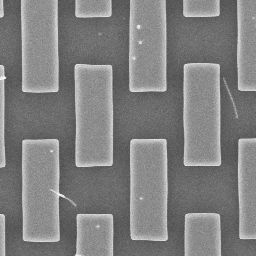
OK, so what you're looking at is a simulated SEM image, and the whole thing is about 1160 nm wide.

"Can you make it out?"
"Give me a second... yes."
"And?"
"groups of lines, slits or small figures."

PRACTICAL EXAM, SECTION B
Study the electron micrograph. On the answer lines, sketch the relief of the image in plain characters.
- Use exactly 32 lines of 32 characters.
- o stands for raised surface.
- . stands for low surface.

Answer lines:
...oooo..ooooo..ooooo..oooo...oo
...oooo..ooooo..ooooo..oooo...oo
...oooo.........ooooo.........oo
...oooo.........ooooo.........oo
...oooo.........ooooo.........oo
...oooo.........ooooo.........oo
...oooo.........ooooo.........oo
...oooo.........ooooo.........oo
...oooo..ooooo..ooooo..oooo...oo
o..oooo..ooooo..ooooo..oooo...oo
...oooo..ooooo..ooooo..oooo...oo
.........ooooo.........oooo.....
.........ooooo.........oooo.....
.........ooooo.........oooo.....
.........ooooo.........oooo.....
..........oooo.........oooo.....
..........oooo.........oooo.....
.........ooooo....oo...oooo...oo
o..oooo..ooooo..ooooo..oooo...oo
o..oooo..ooooo..ooooo..ooooo..oo
o..oooo..ooooo..ooooo..oooo...oo
...oooo.........ooooo.........oo
...oooo.........ooooo.........oo
...oooo.........ooooo.........oo
...oooo.........ooooo.........oo
...oooo.........ooooo.........oo
...oooo.........ooooo.........oo
o..oooo...oooo..ooooo..oooo...oo
o..oooo...oooo..ooooo..oooo...oo
o..oooo...oooo..ooooo..oooo...oo
o.........oooo.........ooooo....
o........ooooo.........ooooo....